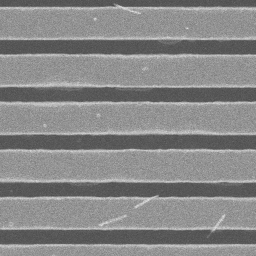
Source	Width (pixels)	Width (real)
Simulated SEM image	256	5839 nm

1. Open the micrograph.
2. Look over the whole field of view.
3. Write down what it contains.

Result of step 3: lines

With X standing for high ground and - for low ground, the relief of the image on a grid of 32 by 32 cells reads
--------------------------------
XXXXXXXXXXXXXXXXXXXXXXXXXXXXXXXX
XXXXXXXXXXXXXXXXXXXXXXXXXXXXXXXX
XXXXXXXXXXXXXXXXXXXXXXXXXXXXXXXX
XXXXXXXXXXXXXXXXXXXXXXXXXXXXXXXX
--------------------------------
--------------------------------
XXXXXXXXXXXXXXXXXXXXXXXXXXXXXXXX
XXXXXXXXXXXXXXXXXXXXXXXXXXXXXXXX
XXXXXXXXXXXXXXXXXXXXXXXXXXXXXXXX
XXXXXXXXXXXXXXXXXXXXXXXXXXXXXXXX
--------------------------------
--------------------------------
XXXXXXXXXXXXXXXXXXXXXXXXXXXXXXXX
XXXXXXXXXXXXXXXXXXXXXXXXXXXXXXXX
XXXXXXXXXXXXXXXXXXXXXXXXXXXXXXXX
XXXXXXXXXXXXXXXXXXXXXXXXXXXXXXXX
--------------------------------
--------------------------------
XXXXXXXXXXXXXXXXXXXXXXXXXXXXXXXX
XXXXXXXXXXXXXXXXXXXXXXXXXXXXXXXX
XXXXXXXXXXXXXXXXXXXXXXXXXXXXXXXX
XXXXXXXXXXXXXXXXXXXXXXXXXXXXXXXX
--------------------------------
--------------------------------
XXXXXXXXXXXXXXXXXXXXXXXXXXXXXXXX
XXXXXXXXXXXXXXXXXXXXXXXXXXXXXXXX
XXXXXXXXXXXXXXXXXXXXXXXXXXXXXXXX
XXXXXXXXXXXXXXXXXXXXXXXXXXXXXXXX
--------------------------------
--------------------------------
XXXXXXXXXXXXXXXXXXXXXXXXXXXXXXXX